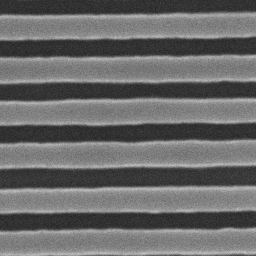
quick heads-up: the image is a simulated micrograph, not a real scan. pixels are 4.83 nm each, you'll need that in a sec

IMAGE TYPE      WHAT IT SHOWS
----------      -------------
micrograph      lines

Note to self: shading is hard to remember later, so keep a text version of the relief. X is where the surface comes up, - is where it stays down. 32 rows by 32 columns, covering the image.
--------------------------------
--------------------------------
XXXXXXXXXXXXXXXXXXXXXXXXXXXXXXXX
XXXXXXXXXXXXXXXXXXXXXXXXXXXXXXXX
XXXXXXXXXXXXXXXXXXXXXXXXXXXXXXX-
--------------------------------
--------------------------------
XXXXXXXXXXXXXXXXXXXXXXXXXXXXXXXX
XXXXXXXXXXXXXXXXXXXXXXXXXXXXXXXX
XXXXXXXXXXXXXXXXXXXXXXXXXXXXXXXX
--------------------------------
--------------------------------
-----------------XXXXX----XXXXXX
XXXXXXXXXXXXXXXXXXXXXXXXXXXXXXXX
XXXXXXXXXXXXXXXXXXXXXXXXXXXXXXXX
XX---------XXX------------------
--------------------------------
--------------------------------
XXXXXXXXXXXXXXXXXXXXXXXXXXXXXXXX
XXXXXXXXXXXXXXXXXXXXXXXXXXXXXXXX
XXXXXXXXXXXXXXXXXXXXXXXXXXXXXXXX
--------------------------------
--------------------------------
---------------------X-XXXXXXXXX
XXXXXXXXXXXXXXXXXXXXXXXXXXXXXXXX
XXXXXXXXXXXXXXXXXXXXXXXXXXXXXXXX
XX--XXX------------X------------
--------------------------------
--------------------------------
XXXXXXXXXXXXXXXXXXXXXXXXXXXXXXXX
XXXXXXXXXXXXXXXXXXXXXXXXXXXXXXXX
XXXXXXXXXXXXXXXXXXXXXXXXXXXXXXXX